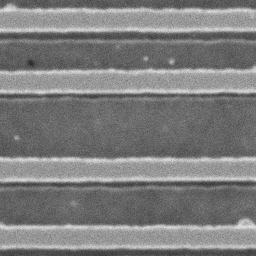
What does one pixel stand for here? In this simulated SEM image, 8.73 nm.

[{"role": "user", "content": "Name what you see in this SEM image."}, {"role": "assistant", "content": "lines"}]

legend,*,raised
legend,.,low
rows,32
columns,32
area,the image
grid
................................
********************************
********************************
********************************
................................
................................
................................
................................
................................
********************************
********************************
******************.*********.***
................................
................................
................................
................................
................................
................................
................................
................................
********************************
********************************
***********.**..................
................................
................................
................................
................................
................................
********************************
********************************
********************************
................................